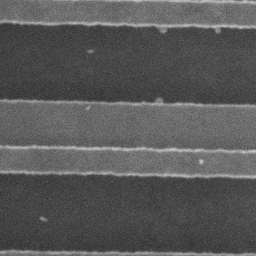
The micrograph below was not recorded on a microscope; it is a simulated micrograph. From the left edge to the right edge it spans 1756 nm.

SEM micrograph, lines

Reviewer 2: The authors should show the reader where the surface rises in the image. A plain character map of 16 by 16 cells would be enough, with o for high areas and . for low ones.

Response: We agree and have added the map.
oooooooooooooooo
...o.ooooooooooo
................
................
................
................
oooooooooooo....
oooooooooooooooo
oooooooooooooooo
oooooooooooooooo
oooooooooooooooo
................
................
................
................
................